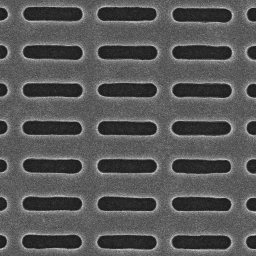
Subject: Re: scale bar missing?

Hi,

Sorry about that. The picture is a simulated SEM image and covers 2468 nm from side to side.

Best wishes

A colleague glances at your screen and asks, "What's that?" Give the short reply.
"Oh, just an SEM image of a regular array of holes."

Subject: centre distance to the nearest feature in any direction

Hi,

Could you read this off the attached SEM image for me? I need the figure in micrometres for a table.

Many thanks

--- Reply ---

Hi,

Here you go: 0.365